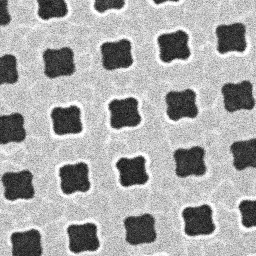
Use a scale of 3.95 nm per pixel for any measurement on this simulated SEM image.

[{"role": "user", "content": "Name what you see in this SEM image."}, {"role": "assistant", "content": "a regular array of holes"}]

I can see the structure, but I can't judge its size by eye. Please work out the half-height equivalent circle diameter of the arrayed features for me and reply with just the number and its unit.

132 nm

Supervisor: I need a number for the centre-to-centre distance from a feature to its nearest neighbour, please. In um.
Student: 0.228